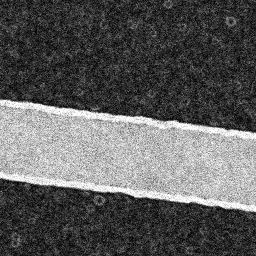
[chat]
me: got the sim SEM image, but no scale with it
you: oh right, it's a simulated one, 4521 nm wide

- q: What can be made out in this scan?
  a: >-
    one or a few lines or trenches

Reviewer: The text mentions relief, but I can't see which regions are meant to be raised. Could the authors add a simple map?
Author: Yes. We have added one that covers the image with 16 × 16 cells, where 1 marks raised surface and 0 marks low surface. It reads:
1111111111111111
1111111111111111
1111111111111111
1111111111111111
1111111111111111
1111111111111111
1111111111111111
0000000011111111
0000000000000000
0000000000000000
0000000000000000
1111000000000000
1111111111110000
1111111111111111
1111111111111111
1111111111111111